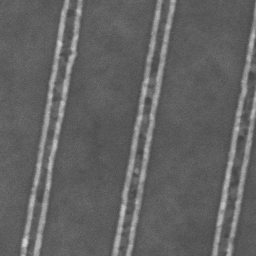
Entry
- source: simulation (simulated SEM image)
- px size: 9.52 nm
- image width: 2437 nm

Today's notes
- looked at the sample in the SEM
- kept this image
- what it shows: one or a few lines or trenches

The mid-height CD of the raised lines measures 120 nm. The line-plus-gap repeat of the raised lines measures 888 nanometers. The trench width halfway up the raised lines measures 761 nanometers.